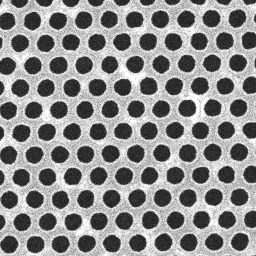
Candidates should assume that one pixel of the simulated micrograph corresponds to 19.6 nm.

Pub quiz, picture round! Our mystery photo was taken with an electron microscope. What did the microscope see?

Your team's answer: a regular array of holes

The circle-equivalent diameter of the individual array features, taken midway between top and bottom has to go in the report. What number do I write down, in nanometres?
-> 356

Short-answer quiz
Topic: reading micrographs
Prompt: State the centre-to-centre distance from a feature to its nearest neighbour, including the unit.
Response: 25.4 px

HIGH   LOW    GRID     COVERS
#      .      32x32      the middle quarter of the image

.##....##.....#.....##....##....
.##....###...###....###...###...
####.######.####################
####################..#####..###
....##....###....##....###....##
....##.....#.....##.....#.....##
....##.....#.....##....##.....##
....###...###...####...###...###
################################
####..####...####..####...###...
.##....###....##....##.....##...
.##....##.....##....##.....##...
.##....###...###....##....###...
####..#####.#####.##############
###########################..###
#...###...###....##....###....##
....##.....#.....##....##.....##
....##.....#.....##....###....##
....###...###...####...###...###
################################
#####.####...####..####...####..
.##....##.....##....##.....##...
.##.....#.....##....##.....##...
.##....###....##....###...###...
####...###..#####..#####.#####..
################################
#...###...###....###...###....##
.....#.....##....##.....#.....##
....##.....##....##.....##....##
....###...###....##....###...###
################################
#####.#####..####...####..####..